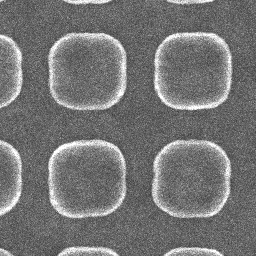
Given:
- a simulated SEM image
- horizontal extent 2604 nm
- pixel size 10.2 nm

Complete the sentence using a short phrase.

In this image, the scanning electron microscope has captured raised bodies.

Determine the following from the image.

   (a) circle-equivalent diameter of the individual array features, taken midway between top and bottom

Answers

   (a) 0.797 micrometres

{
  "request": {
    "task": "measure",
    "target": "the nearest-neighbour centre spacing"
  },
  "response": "1070 nanometers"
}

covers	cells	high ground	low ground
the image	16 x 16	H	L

LLLLLLLLLLLLLLLL
LLLLLLLLLLLLLLLL
LLLLHHHLLLHHHHLL
HLLHHHHHLLHHHHLL
HLLHHHHHLLHHHHLL
HLLHHHHHLLHHHHLL
LLLLHHHLLLLHHLLL
LLLLLLLLLLLLLLLL
LLLLLLLLLLLLLLLL
HLLLHHHLLLHHHHLL
HLLHHHHHLLHHHHLL
HLLHHHHHLLHHHHLL
HLLHHHHHLLHHHHLL
LLLLLLLLLLLLHLLL
LLLLLLLLLLLLLLLL
LLLLLLLLLLLLLLLL